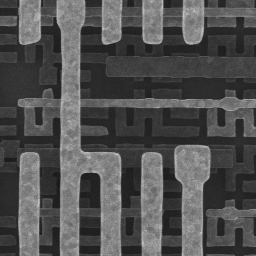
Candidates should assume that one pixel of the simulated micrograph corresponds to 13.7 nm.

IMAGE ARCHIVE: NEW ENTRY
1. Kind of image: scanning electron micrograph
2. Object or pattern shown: wiring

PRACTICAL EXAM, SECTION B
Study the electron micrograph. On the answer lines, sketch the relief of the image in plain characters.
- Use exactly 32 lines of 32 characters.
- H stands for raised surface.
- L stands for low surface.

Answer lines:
LLHHHLLHHHHLLHHLLLHHLLLHHLLLLLLL
LLHHHLLHHHHLLHHLLLHHLLLHHLLLLLLL
LLHHHLLHHHHLLHHLLLHHLLLHHLLLLLLL
LLHHHLLHHHLLLHHLLLHHLLLHHLLLLLLL
LLHHHLLLHHLLLHHLLLHHLLLHHLLLLLLL
LLLHLLLLHHLLLHLLLLLHLLLLHLLLLLLL
LLLLLLLLHHLLLLLLLLLLLLLLLLLLLLLL
LLLLLLLLHHLLLLLLLLLLLLLLLLLLLLLL
LLLLLLLLHHLLLLLLLLLLLLLLLLLLLLLL
LLLLLLLLHHLLLLLLLLLLLLLLLLLLLLLL
LLLLLLLLHHLLLLLLLLLLLLLLLLLLLLLL
LLLLLLLLHHLLLLLLLLLLLLLLLLLLLLLL
LLLLLLLLHHLLLLLLLLLLLLLLLLLLLLLL
LLLLLLLLHHLLLLLLLLLLLLLLLLLLLLLL
LLLLLLLLHHLLLLLLLLLLLLLLLLLLLLLL
LLLLLLLLHHLLLLLLLLLLLLLLLLLLLLLL
LLLLLLLLHHLLLLLLLLLLLLLLLLLLLLLL
LLLLLLLLHHLLLLLLLLLLLLLLLLLLLLLL
LLLLLLLLHHLLLLLLLLLLLLHHHHLLLLLL
LLLHHLLLHHHHHHHLLLHHLLHHHHLLLLLL
LLLHHLLLHHHHHHHLLLHHLLHHHHLLLLLL
LLHHHLLLHHHHHHHLLLHHLLHHHHLLLLLL
LLHHHLLLHHLLLHHLLLHHLLHHHHLLLLLL
LLHHHLLLHHLLLHHLLLHHLLLHHLLLLLLL
LLHHHLLLHHLLLHHLLLHHLLLHHLLLLLLL
LLHHHLLLHHLLLHHLLLHHLLLHHLLLLLLL
LLHHHLLLHHLLLHHLLLHHLLLHHLLLLLLL
LLHHHLLLHHLLLHHLLLHHLLLHHLLLLLLL
LLHHHLLLHHLLLHHLLLHHLLLHHLLLLLLL
LLHHHLLHHHLLLHHLLLHHLLLHHLLLLLLL
LLHHHLLHHHLLLHHLLLHHLLLHHLLLLLLL
LLHHHLLLHHLLLHHLLLHHLLLHHLLLLLLL